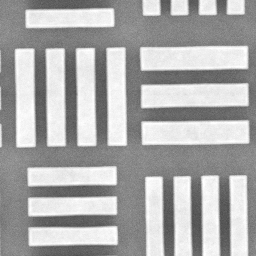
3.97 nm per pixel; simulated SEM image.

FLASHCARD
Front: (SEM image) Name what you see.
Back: groups of lines, slits or small figures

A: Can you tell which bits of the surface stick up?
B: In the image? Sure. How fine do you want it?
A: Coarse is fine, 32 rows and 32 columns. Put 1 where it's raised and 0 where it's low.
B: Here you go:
00000000000000000011011001100100
00001111111111000011001001100100
00011111111111000000000000000000
00000000000000000000000000000000
00000000000000000000000000000000
00000000000000000000000000000000
00110011001101110011111111111110
00110011001101110011111111111110
00110011001100110011111111111110
00110011001100110000000000000000
00110011001100110000000000000000
00110011001100110011111111111110
00110011001100110011111111111110
00110011001100110000000000000000
00110011001100110000000000000000
00110011001100110011111111111110
00110011001100110011111111111110
00110011001100110011111111111110
00000000000000000000000000000000
00000000000000000000000000000000
00000000000000000000000000000000
00001111111111000000000000000000
00001111111111000011001101100110
00000000000000000011001101100110
00000000000000000011001101100110
00001111111111000011001101100110
00001111111111000011001101100110
00000000000000000011001101100110
00000011000111000011001101100110
00001111111111100011001101100110
00001111111111000011001101100110
00000000000000000011001101100110